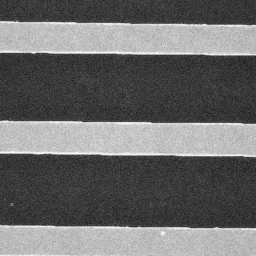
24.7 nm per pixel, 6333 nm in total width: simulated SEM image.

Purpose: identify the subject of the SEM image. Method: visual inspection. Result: lines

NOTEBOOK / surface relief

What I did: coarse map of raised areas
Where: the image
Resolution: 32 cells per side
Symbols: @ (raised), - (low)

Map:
--------------------------------
--------------------------------
--------------------------------
@@@@@@@@@@@@@@@@@@@@@@@@@@@@@@@@
@@@@@@@@@@@@@@@@@@@@@@@@@@@@@@@@
@@@@@@@@@@@@@@@@@@@@@@@@@@@@@@@@
@@@@@@@@@@@@@@@@@@@@@@@@@@@@@@@@
--------------------------------
--------------------------------
--------------------------------
--------------------------------
--------------------------------
--------------------------------
--------------------------------
--------------------------------
@@@@@@@@@@@@@@@@@@@@@@@@@@@@@@@-
@@@@@@@@@@@@@@@@@@@@@@@@@@@@@@@@
@@@@@@@@@@@@@@@@@@@@@@@@@@@@@@@@
@@@@@@@@@@@@@@@@@@@@@@@@@@@@@@@@
------------------------------@@
--------------------------------
--------------------------------
--------------------------------
--------------------------------
--------------------------------
--------------------------------
--------------------------------
--------------------------------
@@@@@@@@@@@@@@@@----------------
@@@@@@@@@@@@@@@@@@@@@@@@@@@@@@@@
@@@@@@@@@@@@@@@@@@@@@@@@@@@@@@@@
@@@@@@@@@@@@@@@@@@@@@@@@@@@@@@@@